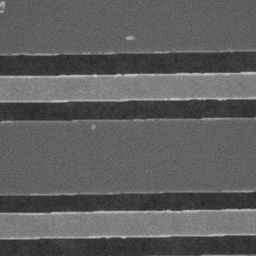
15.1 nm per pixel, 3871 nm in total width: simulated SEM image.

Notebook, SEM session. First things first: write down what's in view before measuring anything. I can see lines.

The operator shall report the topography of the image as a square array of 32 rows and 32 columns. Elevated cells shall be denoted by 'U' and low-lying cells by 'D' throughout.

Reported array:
UUUUUUUUUUUUUUUUUUUUUUUUUUUUUUUU
UUUUUUUUUUUUUUUUUUUUUUUUUUUUUUUU
UUUUUUUUUUUUUUUUUUUUUUUUUUUUUUUU
UUUUUUUUUUUUUUUUUUUUUUUUUUUUUUUU
UUUUUUUUUUUUUUUUUUUUUUUUUUUUUUUU
UUUUUUUUUUUUUUUUUUUUUUUUUUUUUUUU
UUUUUUUUUUUUUUUUUUUUUUDDDDDDDDDD
DDDDDDDDDDDDDDDDDDDDDDDDDDDDDDDD
DDDDDDDDDDDDDDDDDDDDDDDDDDDDDDDD
DDDDDDDDUUUUUUUUUUUUUUUUUUUUUUUU
UUUUUUUUUUUUUUUUUUUUUUUUUUUUUUUU
UUUUUUUUUUUUUUUUUUUUUUUUUUUUUUUU
UUUUUUUUUUUUUUUUDDDDDDDDDDDDDDDD
DDDDDDDDDDDDDDDDDDDDDDDDDDDDDDDD
DDDDDDDDDDDDDDDDDDDDDDDDDDDDDDDD
UUUUUUUUUUUUUUUUUUUUUUUUUUUUUUUU
UUUUUUUUUUUUUUUUUUUUUUUUUUUUUUUU
UUUUUUUUUUUUUUUUUUUUUUUUUUUUUUUU
UUUUUUUUUUUUUUUUUUUUUUUUUUUUUUUU
UUUUUUUUUUUUUUUUUUUUUUUUUUUUUUUU
UUUUUUUUUUUUUUUUUUUUUUUUUUUUUUUU
UUUUUUUUUUUUUUUUUUUUUUUUUUUUUUUU
UUUUUUUUUUUUUUUUUUUUUUUUUUUUUUUU
UUUUUUUUUUUUUUUUUUUUUUUUUUUUUUUU
DDDDDDDDDDDDDDDDDDDDDDDDDDDDDDDD
DDDDDDDDDDDDDDDDDDDDDDDDDDDDDDDD
DDDDDDDDDDDDUUUUUUUUUUUUUUUUUUUU
UUUUUUUUUUUUUUUUUUUUUUUUUUUUUUUU
UUUUUUUUUUUUUUUUUUUUUUUUUUUUUUUU
UUUUUUUUUUUUUUUUUUUUUUDDDDDDDDDD
DDDDDDDDDDDDDDDDDDDDDDDDDDDDDDDD
DDDDDDDDDDDDDDDDDDDDDDDDDDDDDDDD